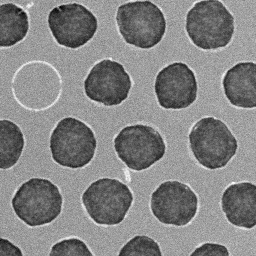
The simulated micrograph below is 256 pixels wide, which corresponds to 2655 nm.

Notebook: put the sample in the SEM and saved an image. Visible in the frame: a regular array of holes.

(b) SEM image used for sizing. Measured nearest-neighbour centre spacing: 0.697 micrometres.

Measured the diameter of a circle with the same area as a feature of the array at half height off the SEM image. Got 492 nm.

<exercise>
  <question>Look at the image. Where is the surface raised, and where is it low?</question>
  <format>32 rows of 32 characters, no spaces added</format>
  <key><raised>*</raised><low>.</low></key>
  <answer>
*.******..******...*****....****
...***.....****.....****.....***
....**......***......**......***
....**......***......**......***
...****.....***.....****.....***
..*****....*****....****....****
********************************
*************.******************
***********....******...*****...
***********.....****....****....
**********......***......***....
***********.....***......***....
***********.....****....*****...
*********************..*********
********************************
..*****....*************....****
...****.....***.....****.....***
...***......**......****......**
...***......**.......***......**
..****......***.....****.....***
..*****....*****...******...****
********************************
****..******...*****************
**.....****.....****....****....
**......**.......**......***....
**......**......***......***....
**......***.....***......***....
***....*****...*****....*****...
********************************
*****************.**************
..*****....*****....*****..*****
...***.....****.....****....****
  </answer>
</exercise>